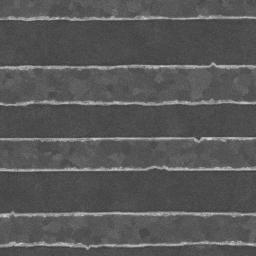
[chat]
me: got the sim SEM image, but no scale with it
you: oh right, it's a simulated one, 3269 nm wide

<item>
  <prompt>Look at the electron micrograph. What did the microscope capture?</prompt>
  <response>one or a few lines or trenches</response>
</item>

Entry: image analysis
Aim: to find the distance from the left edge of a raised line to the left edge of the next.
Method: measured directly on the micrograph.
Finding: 922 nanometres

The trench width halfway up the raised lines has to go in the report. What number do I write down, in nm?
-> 557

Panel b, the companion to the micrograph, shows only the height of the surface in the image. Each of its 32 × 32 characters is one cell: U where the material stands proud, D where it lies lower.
UUUUUUUUUUUUUUUUUUUUUUUUUUUUUUUU
UUUUUUUUUUUUUUUUUUUUUUUUUUUUUUUU
DDDDDDDDDDDDDDDDDDDDDDDDDDDDDDDD
DDDDDDDDDDDDDDDDDDDDDDDDDDDDDDDD
DDDDDDDDDDDDDDDDDDDDDDDDDDDDDDDD
DDDDDDDDDDDDDDDDDDDDDDDDDDDDDDDD
DDDDDDDDDDDDDDDDDDDDDDDDDDDDDDDD
DDDDDDDDDDDDDDDDDDDDDDDDDDDDDDDD
UUUUUUUUUUUUUUUUUUUUUUUUUUUUUUUU
UUUUUUUUUUUUUUUUUUUUUUUUUUUUUUUU
UUUUUUUUUUUUUUUUUUUUUUUUUUUUUUUU
UUUUUUUUUUUUUUUUUUUUUUUUUUUUUUUU
UUUUUUUUUUUUUUUUUUUUUUUUUUUUUUUU
DDDDDDDDDDDDDDDDDDDDDDDDDDDDDDDD
DDDDDDDDDDDDDDDDDDDDDDDDDDDDDDDD
DDDDDDDDDDDDDDDDDDDDDDDDDDDDDDDD
DDDDDDDDDDDDDDDDDDDDDDDDDDDDDDDD
UUUUUUUUUUUUUUUUUUUUUUUUUUUUUUUU
UUUUUUUUUUUUUUUUUUUUUUUUUUUUUUUU
UUUUUUUUUUUUUUUUUUUUUUUUUUUUUUUU
UUUUUUUUUUUUUUUUUUUUUUUUUUUUUUUU
DDDDDDDDDDDDDDDDDDDDDDDDDDDDDDDD
DDDDDDDDDDDDDDDDDDDDDDDDDDDDDDDD
DDDDDDDDDDDDDDDDDDDDDDDDDDDDDDDD
DDDDDDDDDDDDDDDDDDDDDDDDDDDDDDDD
DDDDDDDDDDDDDDDDDDDDDDDDDDDDDDDD
DDDDDDDDDDDDDDDDDDDDDDDDDDDDDDDD
UUUUUUUUUUUUUUUUUUUUUUUUUUUUUUUU
UUUUUUUUUUUUUUUUUUUUUUUUUUUUUUUU
UUUUUUUUUUUUUUUUUUUUUUUUUUUUUUUU
UUUUUUUUUUUUUUUUUUUUUUUUDDDDDDDU
DDDDDDDDDDDDDDDDDDDDDDDDDDDDDDDD